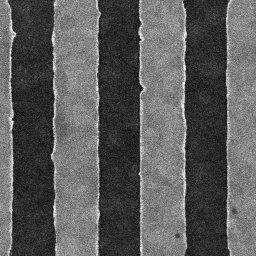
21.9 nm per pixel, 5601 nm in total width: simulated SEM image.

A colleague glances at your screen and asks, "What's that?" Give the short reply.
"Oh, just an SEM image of one or a few lines or trenches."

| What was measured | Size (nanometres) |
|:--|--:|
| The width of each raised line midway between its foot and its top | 974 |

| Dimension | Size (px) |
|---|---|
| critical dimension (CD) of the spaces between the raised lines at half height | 42.6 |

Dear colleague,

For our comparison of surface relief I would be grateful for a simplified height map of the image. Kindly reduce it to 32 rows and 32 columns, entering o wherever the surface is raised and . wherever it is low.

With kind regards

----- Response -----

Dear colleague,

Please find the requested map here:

o......ooooo.....oooooo......ooo
o......ooooo.....oooooo.....oooo
o......ooooo......ooooo.....oooo
o......ooooo.....oooooo.....oooo
oo.....ooooo......ooooo.....oooo
oo.....ooooo......ooooo.....oooo
o......ooooo......ooooo.....oooo
o......ooooo......ooooo.....oooo
o......ooooo......ooooo.....oooo
o......ooooo......ooooo.....oooo
o......ooooo......ooooo.....oooo
o......ooooo......ooooo.....oooo
o......ooooo......ooooo.....oooo
oo.....ooooo......ooooo.....oooo
oo.....ooooo......ooooo.....oooo
o......ooooo......ooooo.....oooo
o......ooooo......ooooo.....oooo
oo.....ooooo......ooooo.....oooo
oo.....ooooo......ooooo.....oooo
o.....oooooo......ooooo.....oooo
oo.....ooooo......ooooo.....oooo
oo.....ooooo.....oooooo.....oooo
o......ooooo......ooooo.....oooo
oo.....ooooo......ooooo.....oooo
o......ooooo......ooooo.....oooo
o......ooooo......ooooo.....oooo
o......ooooo......ooooo.....oooo
o......ooooo......ooooo.....oooo
o......ooooo......ooooo.....oooo
o......ooooo......ooooo......ooo
o......ooooo......ooooo......ooo
o......ooooo......ooooo......ooo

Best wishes